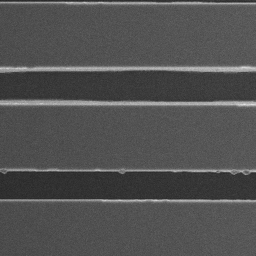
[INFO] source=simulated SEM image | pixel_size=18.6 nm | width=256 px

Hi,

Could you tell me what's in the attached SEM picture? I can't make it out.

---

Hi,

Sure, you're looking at lines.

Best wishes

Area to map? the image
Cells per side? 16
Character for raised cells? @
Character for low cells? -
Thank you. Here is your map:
@@@@@@@@@@@@@@@@
@@@@@@@@@@@@@@@@
@@@@@@@@@@@@@@@@
@@@@@@@@@@@@@@@@
----------------
----------------
@@@@@@@---------
@@@@@@@@@@@@@@@@
@@@@@@@@@@@@@@@@
@@@@@@@@@@@@@@@@
@@@@@@@@@@@@@@@@
----------------
----------------
@@@@@@@@@@@@@@@@
@@@@@@@@@@@@@@@@
@@@@@@@@@@@@@@@@